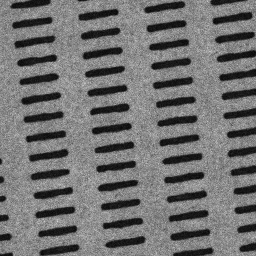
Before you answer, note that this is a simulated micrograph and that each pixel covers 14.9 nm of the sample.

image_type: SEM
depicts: a regular array of holes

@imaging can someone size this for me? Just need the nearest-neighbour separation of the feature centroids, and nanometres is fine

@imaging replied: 283